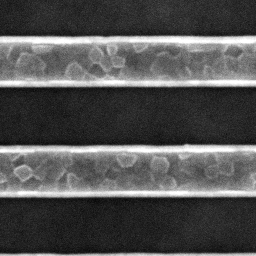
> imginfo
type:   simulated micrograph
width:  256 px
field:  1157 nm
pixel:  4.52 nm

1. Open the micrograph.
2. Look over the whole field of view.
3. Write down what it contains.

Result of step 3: one or a few lines or trenches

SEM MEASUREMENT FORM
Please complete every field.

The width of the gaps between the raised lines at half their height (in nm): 286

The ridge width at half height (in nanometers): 207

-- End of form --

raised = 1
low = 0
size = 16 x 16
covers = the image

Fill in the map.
0000000000000000
0000000000000000
1110110111111111
1111111111111111
1111111111111111
0000000000000000
0000000000000000
0000000000000000
0000000000000000
1111111111111111
1111111111111111
1111111111111111
0000000000000000
0000000000000000
0000000000000000
0000000000000000